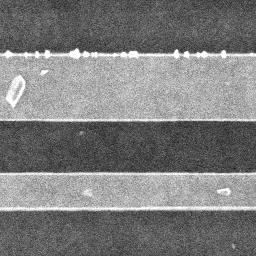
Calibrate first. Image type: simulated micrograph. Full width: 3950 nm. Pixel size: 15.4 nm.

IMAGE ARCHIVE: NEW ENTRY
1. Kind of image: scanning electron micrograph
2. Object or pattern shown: lines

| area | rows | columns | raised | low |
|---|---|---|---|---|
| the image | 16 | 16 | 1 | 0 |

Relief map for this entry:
0000000000000000
0000000000000000
0000000000000000
1111111111111111
1111111111111111
1111111111111111
1111111111111111
1111111111111111
0000000000000000
0000000000000000
0000000000000000
1111111111111111
1111111111111111
0000000000000000
0000000000000000
0000000000000000